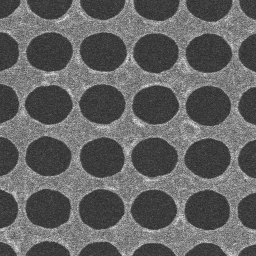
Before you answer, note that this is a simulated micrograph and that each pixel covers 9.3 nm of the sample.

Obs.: a regular array of holes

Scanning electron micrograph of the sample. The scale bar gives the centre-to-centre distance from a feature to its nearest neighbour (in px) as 52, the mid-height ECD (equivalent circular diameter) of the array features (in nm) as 399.